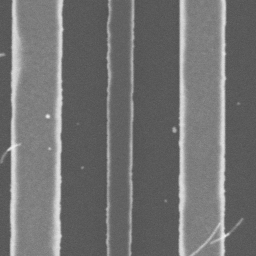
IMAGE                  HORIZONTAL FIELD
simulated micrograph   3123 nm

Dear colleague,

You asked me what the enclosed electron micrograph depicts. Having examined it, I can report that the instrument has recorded lines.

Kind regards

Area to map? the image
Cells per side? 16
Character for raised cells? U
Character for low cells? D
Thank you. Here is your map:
DUUUDDDDDDDUUUDD
DUUUDDDDDDDUUUDD
DUUUDDDDDDDUUUDD
DUUUDDDDDDDUUUDD
DUUUDDDDDDDUUUDD
DUUUDDDDDDDUUUDD
DUUUDDDDDDDUUUDD
DUUUDDDDDDDUUUDD
DUUUDDDDDDDUUUDD
DUUUDDDDDDDUUUDD
DUUUDDDDDDDUUUDD
DUUUDDDDDDDUUUDD
DUUUDDDDDDDUUUDD
DUUUDDDDDDDUUUDD
DUUUDDDDDDDUUUDD
DUUUDDDDDDDUUUDD